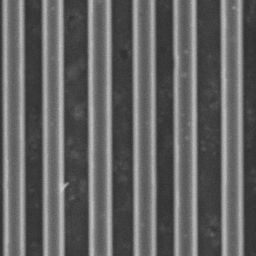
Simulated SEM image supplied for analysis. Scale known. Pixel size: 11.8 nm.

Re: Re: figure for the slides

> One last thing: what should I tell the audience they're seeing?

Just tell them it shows parallel lines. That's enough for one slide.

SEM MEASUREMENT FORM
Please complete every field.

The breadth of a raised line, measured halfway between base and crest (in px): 20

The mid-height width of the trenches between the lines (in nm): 288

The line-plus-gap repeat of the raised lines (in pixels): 43.7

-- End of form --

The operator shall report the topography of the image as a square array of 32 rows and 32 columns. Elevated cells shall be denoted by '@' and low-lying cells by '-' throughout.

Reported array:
@@@--@@@---@@@---@@---@@----@@--
@@@---@@---@@@---@@---@@----@@--
@@@---@@---@@@---@@---@@----@@--
-@@---@@---@@@---@@---@@----@@--
-@@---@@---@@@---@@---@@----@@--
-@@---@@---@@@---@@---@@----@@--
-@@---@@---@@@---@@---@@----@@--
-@@---@@---@@@---@@---@@----@@--
-@@---@@---@@@---@@---@@----@@--
-@@---@@---@@@---@@---@@----@@--
-@@---@@---@@@---@@---@@----@@--
-@@---@@---@@@---@@---@@----@@--
-@@---@@---@@@---@@---@@----@@--
-@@---@@---@@@---@@---@@----@@--
-@@---@@---@@@---@@---@@----@@--
-@@---@@---@@@---@@---@@----@@--
-@@---@@---@@@---@@---@@----@@--
-@@---@@---@@@---@@---@@----@@--
-@@---@@---@@@---@@---@@----@@--
-@@---@@---@@@---@@---@@----@@--
-@@---@@---@@@---@@---@@----@@--
-@@---@@---@@@---@@---@@----@@--
-@@---@@---@@@---@@---@@----@@--
-@@---@@---@@@---@@---@@----@@--
-@@---@@---@@@---@@---@@----@@--
-@@---@@---@@@---@@---@@----@@--
-@@---@@---@@@---@@---@@----@@--
-@@---@@---@@@---@@---@@----@@--
-@@---@@---@@@---@@---@@----@@--
-@@---@@---@@@---@@---@@----@@--
-@@---@@---@@@---@@---@@----@@--
-@@---@@---@@@---@@---@@----@@--